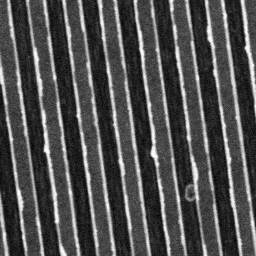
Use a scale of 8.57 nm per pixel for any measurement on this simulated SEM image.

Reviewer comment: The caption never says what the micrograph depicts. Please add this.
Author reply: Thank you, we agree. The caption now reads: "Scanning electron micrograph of parallel lines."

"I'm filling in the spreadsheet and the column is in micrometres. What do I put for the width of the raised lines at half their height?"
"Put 0.151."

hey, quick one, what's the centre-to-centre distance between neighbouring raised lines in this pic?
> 0.303 um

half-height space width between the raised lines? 151 nm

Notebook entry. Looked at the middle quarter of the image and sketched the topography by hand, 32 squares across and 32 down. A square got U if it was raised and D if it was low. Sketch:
DDUUUUDDDDDUUUUDDDDDUUUUDDDDUUUU
DDUUUUDDDDDUUUUDDDDDUUUUDDDDDUUU
DDUUUUUDDDDUUUUDDDDDUUUUDDDDDUUU
DDUUUUUDDDDUUUUUDDDDUUUUDDDDDUUU
DDUUUUUDDDDUUUUUDDDDUUUUUDDDDUUU
DDDUUUUDDDDDUUUUDDDDUUUUUDDDDUUU
DDDUUUUDDDDDUUUUDDDDUUUUUDDDDUUU
DDDUUUUDDDDDUUUUDDDDDUUUUDDDDDUU
DDDUUUUDDDDDUUUUDDDDDUUUUDDDDDUU
DDDUUUUUDDDDUUUUDDDDDUUUUDDDDDUU
DDDUUUUUDDDDUUUUUDDDDUUUUDDDDDUU
DDDUUUUUDDDDUUUUUDDDDUUUUUDDDDUU
DDDUUUUUDDDDUUUUUDDDDUUUUUDDDDUU
DDDUUUUUDDDDUUUUUDDDDDUUUUDDDDUU
DDDDUUUUDDDDUUUUUDDDDDUUUUDDDDDU
DDDDUUUUDDDDDUUUUDDDDDUUUUDDDDDU
DDDDUUUUUDDDDUUUUDDDDDUUUUDDDDDU
DDDDUUUUUDDDDUUUUUDDDDUUUUDDDDDU
DDDDDUUUUDDDDUUUUUDDDDUUUUUDDDDU
DDDDDUUUUDDDDDUUUUDDDDUUUUUDDDDU
DDDDDUUUUDDDDDUUUUDDDDUUUUUDDDDU
DDDDDUUUUDDDDDUUUUDDDDUUUUUDDDDD
DDDDDUUUUDDDDDUUUUDDDDUUUUUDDDDD
UDDDDUUUUDDDDDUUUUDDDDUUUUUDDDDD
UDDDDUUUUUDDDDUUUUDDDDDUUUUDDDDD
UDDDDUUUUUDDDDUUUUUDDDDUUUUDDDDD
UDDDDDUUUUDDDDUUUUUDDDDUUUUUDDDD
UDDDDDUUUUDDDDDUUUUDDDDUUUUUDDDD
UDDDDDUUUUDDDDDUUUUDDDDDUUUUDDDD
UDDDDDUUUUDDDDDUUUUDDDDDUUUUDDDD
UUDDDDUUUUDDDDDUUUUDDDDDUUUUDDDD
UUDDDDUUUUDDDDDUUUUDDDDDUUUUDDDD